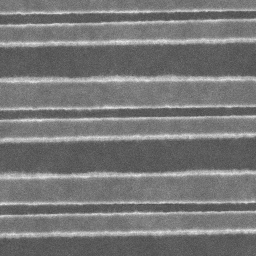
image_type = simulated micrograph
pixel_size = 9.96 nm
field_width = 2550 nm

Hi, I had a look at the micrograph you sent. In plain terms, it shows lines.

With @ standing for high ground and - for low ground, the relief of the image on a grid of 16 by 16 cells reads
@@@@@@@@@@@@@@@@
@@@@@@@@@@@@@@@@
@@@@@@@@@@@@@@--
----------------
----------------
@@@@@@@@@@@@@@@@
@@@@@@@@@@@@@@@@
@@@@@@@@@@@@@@@@
@@@@@@@@@@@-----
----------------
----------------
@@@@@@@@@@@@@@@@
@@@@@@@@@@@@@@@@
@@@@@@@@@@@@@@@@
@@@@@@@@@@@-----
----------------